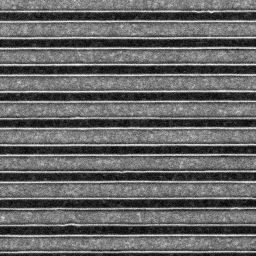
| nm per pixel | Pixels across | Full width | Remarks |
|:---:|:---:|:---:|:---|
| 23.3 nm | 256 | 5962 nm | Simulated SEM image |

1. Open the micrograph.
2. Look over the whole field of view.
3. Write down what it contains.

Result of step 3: parallel lines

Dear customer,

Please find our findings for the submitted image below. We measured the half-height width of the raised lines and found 247 nm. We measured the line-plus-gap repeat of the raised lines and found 622 nm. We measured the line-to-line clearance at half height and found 370 nm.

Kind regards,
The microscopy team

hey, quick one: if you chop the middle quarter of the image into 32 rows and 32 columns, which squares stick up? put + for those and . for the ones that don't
++++++++++++++++++++++++++++++++
++++++++++++++++++++++++++++++++
++++++++++++++++++++++++++++++++
................................
................................
................................
................................
++++++++++++++++++++++++++++++++
++++++++++++++++++++++++++++++++
................................
................................
................................
................................
................................
++++++++++++++++++++++++++++++++
++++++++++++++++++++++++++++++++
................................
................................
................................
................................
++++++++++++++++++++++++++++++++
++++++++++++++++++++++++++++++++
++++++++++++++++++++++++++++++++
................................
................................
................................
................................
++++++++++++++++++++++++++++++++
++++++++++++++++++++++++++++++++
................................
................................
................................